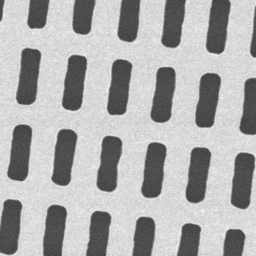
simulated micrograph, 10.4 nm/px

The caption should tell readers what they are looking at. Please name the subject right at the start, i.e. a regular array of holes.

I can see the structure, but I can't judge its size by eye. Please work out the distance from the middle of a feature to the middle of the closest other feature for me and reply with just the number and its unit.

461 nanometres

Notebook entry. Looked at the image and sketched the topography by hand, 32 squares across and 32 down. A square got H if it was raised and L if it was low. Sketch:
LHHHLLHHHLLLHHHLLLHHHLLHHHLLLHHH
HHHHLLHHHLLLHHHLLHHHHLLHHHLLLHHH
HHHLLLHHHLLLHHHLLHHHLLLHHHLLLHHH
HHHHLHHHHLLHHHHLLHHHLLLHHHLLHHHH
HHHHHHHHHHHHHHHLLHHHLLLHHHLLHHHL
HHHHHHHHHHHHHHHHHHHHLLHHHHLLHHHL
HHHLLHHHHHHHHHHHHHHHHHHHHHLLHHHL
HHHLLHHHHLLHHHHLHHHHHHHHHHHHHHHH
HHHLLHHHLLLHHHLLHHHHLHHHHHHHHHHH
HHLLLHHHLLLHHHLLHHHHLLHHHLLHHHHH
HHLLLHHHLLLHHHLLHHHHLLHHHLLLHHHL
HHLLLHHHLLHHHHLLHHHLLLHHHLLHHHLL
HHLLHHHHLLHHHLLLHHHLLLHHHLLHHHLL
HHHHHHHHLLHHHLLLHHHLLHHHLLLHHHLL
HHHHHHHHHHHHHHHHHHHLLHHHLLLHHHLL
HHHHHHHHHHHHHHHHHHHHHHHHHLLHHHLL
HHLLHHHLLHHHHHHHHHHHHHHHHHHHHHLL
HHLLHHHLLLHHHLLHHHHHHHHHHHHHHHHH
HLLLHHHLLHHHHLLHHHLLLHHHLLHHHHHH
HLLLHHHLLHHHHLLHHHLLLHHHLLHHHHLL
HLLLHHHLLHHHHLLHHHLLLHHHLLHHHLLL
HLLLHHHLLHHHLLLHHHLLLHHHLLHHHLLL
HHLHHHHLLHHHLLLHHHLLHHHLLLHHHLLL
HHHHHHHHHHHHLLHHHHLLHHHLLLHHHLLH
HHHHHHHHHHHHHHHHHHLLHHHLLLHHHLLH
LLLHHHHHHHHHHHHHHHHHHHHHHHHHHLLH
LLLHHHLLHHHHLHHHHHHHHHHHHHHHHHHH
LLLHHHLLHHHLLLHHHLLHHHHHHHHHHHHH
LLLHHHLLHHHLLLHHHLLHHHHLLHHHHHHH
LLHHHLLLHHHLLLHHHLLHHHHLLHHHLLLH
LLHHHLLLHHHLLHHHHLLHHHLLLHHHLLLH
LLHHHLLLHHHLLHHHHLLHHHLLLHHHLLHH